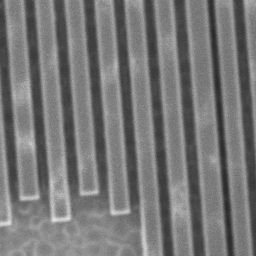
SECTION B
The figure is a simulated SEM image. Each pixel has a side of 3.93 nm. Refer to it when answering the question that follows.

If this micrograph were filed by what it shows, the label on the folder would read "parallel lines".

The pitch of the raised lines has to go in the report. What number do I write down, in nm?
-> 117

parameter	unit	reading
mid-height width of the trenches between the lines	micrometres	0.0479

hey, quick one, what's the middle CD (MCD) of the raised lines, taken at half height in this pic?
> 71.4 nanometres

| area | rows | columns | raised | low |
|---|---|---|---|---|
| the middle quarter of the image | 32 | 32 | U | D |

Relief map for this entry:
DDUUUUDDDUUUUUDDDUUUUDDDUUUUDDDD
DDUUUUDDDUUUUUDDDUUUUDDDUUUUDDDD
DDUUUUDDDUUUUUDDDUUUUDDDUUUUUDDD
DDUUUUDDDUUUUUDDDUUUUDDDUUUUUDDD
DDUUUUDDDUUUUUDDDUUUUDDDUUUUUDDD
DDUUUUDDDDUUUUDDDUUUUDDDUUUUUDDD
DDUUUUDDDDUUUUDDDUUUUDDDUUUUUDDD
DDUUUUDDDDUUUUDDDUUUUUDDDUUUUDDD
DDUUUUUDDDUUUUDDDUUUUUDDDUUUUDDD
DDUUUUUDDDUUUUDDDUUUUUDDDUUUUDDD
DDDUUUUDDDUUUUDDDUUUUUDDDUUUUDDD
DDDUUUUDDDUUUUDDDUUUUUDDDUUUUDDD
DDDUUUUDDDUUUUDDDDUUUUDDDUUUUDDD
DDDUUUUDDDUUUUUDDDUUUUDDDUUUUDDD
DDDUUUUDDDUUUUUDDDUUUUDDDUUUUDDD
DDDUUUUDDDUUUUUDDDUUUUDDDUUUUUDD
DDDUUUUDDDUUUUUDDDUUUUDDDUUUUUDD
DDDUUUUDDDUUUUUDDDUUUUDDDUUUUUDD
DDDUUUUDDDDUUUUDDDUUUUDDDUUUUUDD
DDDUUUUDDDDUUUUDDDUUUUDDDUUUUUDD
DDDUUUUDDDDUUUUDDDUUUUUDDDUUUUDD
DDDUUUUUDDDUUUUDDDUUUUUDDDUUUUDD
DDDUUUUUDDDUUUUDDDUUUUUDDDUUUUDD
DDDDUUUUDDDUUUUDDDUUUUUDDDUUUUDD
DDDDUUUUDDDUUUUDDDUUUUUDDDUUUUDD
DDDDUUUUDDDUUUUDDDDUUUUDDDUUUUDD
UDDDUUUUDDDUUUUDDDDUUUUDDDUUUUDD
UDDDUUUUDDDUUUUDDDDUUUUDDDUUUUUD
UDDDUUUUDDDUUUUUDDDUUUUDDDUUUUUD
UDDDUUUUDDDUUUUUDDDUUUUDDDUUUUUD
UDDDUUUUDDDDUUUUDDDUUUUDDDUUUUUD
UDDDUUUUDDDDUUUUDDDUUUUDDDUUUUUD